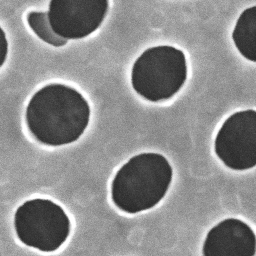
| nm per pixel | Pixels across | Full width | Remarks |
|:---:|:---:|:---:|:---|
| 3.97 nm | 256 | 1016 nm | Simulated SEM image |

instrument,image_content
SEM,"holes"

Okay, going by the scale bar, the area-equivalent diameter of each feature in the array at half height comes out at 229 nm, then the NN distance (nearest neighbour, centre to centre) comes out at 0.429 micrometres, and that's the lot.